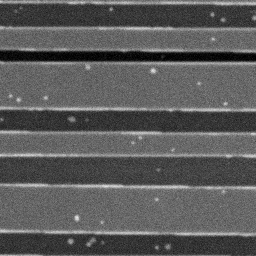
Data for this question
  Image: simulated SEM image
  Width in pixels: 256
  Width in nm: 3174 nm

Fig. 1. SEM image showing lines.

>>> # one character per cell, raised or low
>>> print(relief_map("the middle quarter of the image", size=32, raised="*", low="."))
********************************
********************************
********************************
********************************
********************************
********************************
********************************
********************************
********************************
********************************
********************************
..........................*..***
................................
................................
................................
................................
................................
********************************
********************************
********************************
********************************
********************************
********************************
................................
................................
................................
................................
................................
................................
................................
***************.................
********************************